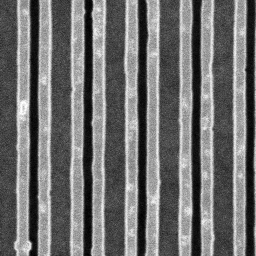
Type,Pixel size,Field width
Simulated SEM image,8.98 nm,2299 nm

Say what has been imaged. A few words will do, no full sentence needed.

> parallel lines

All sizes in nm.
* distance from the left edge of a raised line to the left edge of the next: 243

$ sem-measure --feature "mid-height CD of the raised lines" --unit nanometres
108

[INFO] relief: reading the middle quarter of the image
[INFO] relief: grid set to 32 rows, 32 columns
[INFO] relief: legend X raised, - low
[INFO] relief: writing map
--XXX--XXX-----XXX---XXX-----XXX
--XXX--XXX-----XXX---XXX-----XXX
--XXX--XXX------XX---XXX-----XXX
--XXX--XXX------XX---XXX-----XXX
--XXX--XXX------XX---XX------XXX
--XXX--XXX------XX---XX------XXX
--XXX--XXX------XX---XX------XXX
--XXX--XXX------XX---XXX-----XXX
--XXX--XXX------XX---XXX-----XXX
--XXX--XXX------XX---XXX-----XXX
--XXX--XXX------XX---XXX-----XXX
--XXX--XXX-----XXX---XXX-----XXX
--XXX--XXX-----XXX---XXX-----XXX
--XXX--XXX-----XXX---XXX-----XXX
--XXX--XXX-----XXX---XXX-----XXX
--XXX--XXX-----XXX---XXX-----XXX
--XXX--XXX-----XXX---XXX-----XXX
--XXX--XXX-----XXX---XXX-----XXX
--XXX--XXX-----XXX---XXX-----XXX
--XXX--XXX-----XXX---XXX-----XXX
--XXX--XXX-----XXX---XXX-----XXX
--XXX--XXX------XX---XXX-----XXX
--XXX--XXX------XX---XXX-----XXX
--XXX--XXX------XX---XXX-----XXX
--XXX--XXX------XX---XXX-----XXX
--XXX--XXX------XX---XXX-----XXX
--XXX--XXX------XX---XXX-----XXX
--XXX--XXX------XX---XXX-----XXX
--XXX--XXX------XX---XXX-----XXX
--XXX--XXX------XX---XXX-----XXX
--XXX--XXX------XX---XXX-----XXX
--XXX--XXX------XX---XXX-----XXX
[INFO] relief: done